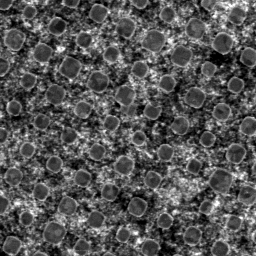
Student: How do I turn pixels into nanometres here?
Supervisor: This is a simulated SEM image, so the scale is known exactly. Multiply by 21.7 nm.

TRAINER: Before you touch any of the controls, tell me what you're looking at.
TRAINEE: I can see a regular array of raised bodies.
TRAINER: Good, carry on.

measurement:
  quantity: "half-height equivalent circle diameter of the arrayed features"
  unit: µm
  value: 0.371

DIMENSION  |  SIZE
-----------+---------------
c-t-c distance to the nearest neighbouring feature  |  662 nm